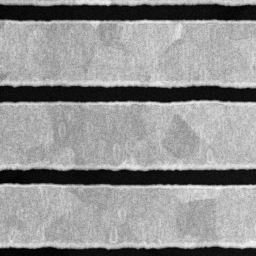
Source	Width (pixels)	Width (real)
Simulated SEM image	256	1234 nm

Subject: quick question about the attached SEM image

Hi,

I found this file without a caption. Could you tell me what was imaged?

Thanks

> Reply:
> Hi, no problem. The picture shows lines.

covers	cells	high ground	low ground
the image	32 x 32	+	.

....++++++.++++++.++........+++.
................................
................................
++++++++++++++++++++++++++++++++
++++++++++++++++++++++++++++++++
++++++++++++++++++++++++++++++++
++++++++++++++++++++++++++++++++
++++++++++++++++++++++++++++++++
++++++++++++++++++++++++++++++++
++++++++++++++++++++++++++++++++
++++++++++++++++++++++++++++++++
................................
................................
++++++++++++++++++++++++++++++++
++++++++++++++++++++++++++++++++
++++++++++++++++++++++++++++++++
++++++++++++++++++++++++++++++++
++++++++++++++++++++++++++++++++
++++++++++++++++++++++++++++++++
++++++++++++++++++++++++++++++++
++++++++++++++++++++++++++++++++
................................
................................
++++++++++++++++++++++++++++++++
++++++++++++++++++++++++++++++++
++++++++++++++++++++++++++++++++
++++++++++++++++++++++++++++++++
++++++++++++++++++++++++++++++++
++++++++++++++++++++++++++++++++
++++++++++++++++++++++++++++++++
++++++++++++++++++++++++++++++++
................................